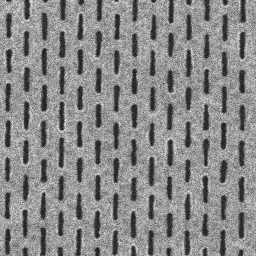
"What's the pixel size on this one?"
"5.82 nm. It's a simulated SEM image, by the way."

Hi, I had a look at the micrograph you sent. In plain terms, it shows a regular array of holes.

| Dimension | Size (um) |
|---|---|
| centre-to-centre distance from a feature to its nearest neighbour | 0.143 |